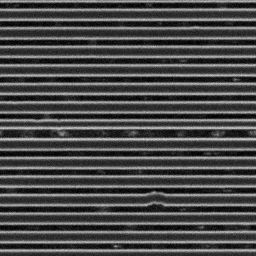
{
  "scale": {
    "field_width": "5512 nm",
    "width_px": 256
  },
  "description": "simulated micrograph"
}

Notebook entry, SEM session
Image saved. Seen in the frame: parallel lines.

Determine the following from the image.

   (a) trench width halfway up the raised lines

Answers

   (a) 151 nm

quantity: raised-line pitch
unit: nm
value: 399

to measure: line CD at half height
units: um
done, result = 0.242